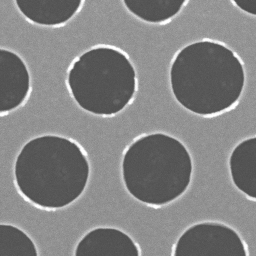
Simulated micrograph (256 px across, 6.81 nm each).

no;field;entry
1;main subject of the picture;holes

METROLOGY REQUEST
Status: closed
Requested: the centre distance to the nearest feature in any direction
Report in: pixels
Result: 103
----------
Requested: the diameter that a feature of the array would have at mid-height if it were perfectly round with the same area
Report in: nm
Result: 480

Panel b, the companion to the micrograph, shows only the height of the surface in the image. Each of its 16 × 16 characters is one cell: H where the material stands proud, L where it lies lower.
HLLLLHHHLLLHHHHL
HHHLHHHHHHHHHHHH
HHHHHHHHHHHHHHHH
LHHHHLLLHHHLLLLH
LLHHLLLLHHHLLLLH
LLHHLLLLHHHLLLLH
LHHHHLLLHHHLLLHH
HHHHHHHHHHHHHHHH
HHHHHHHHHLHHHHHH
HLLLLHHHLLLLHHHL
HLLLLHHHLLLLHHLL
HLLLLHHHLLLLHHHL
HHLLLHHHHLLHHHHH
HHHHHHHHHHHHHHHH
LHHHHHLLHHHHLLLH
LLHHHLLLHHHLLLLH